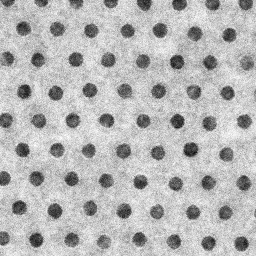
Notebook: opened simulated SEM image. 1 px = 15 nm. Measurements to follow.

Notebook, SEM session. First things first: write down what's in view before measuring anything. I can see a regular array of holes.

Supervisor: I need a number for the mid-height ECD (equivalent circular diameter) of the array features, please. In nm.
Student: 241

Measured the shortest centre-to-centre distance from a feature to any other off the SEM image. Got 490 nanometers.